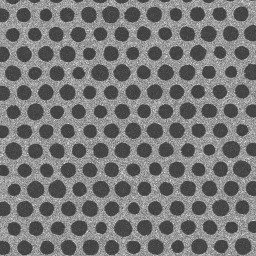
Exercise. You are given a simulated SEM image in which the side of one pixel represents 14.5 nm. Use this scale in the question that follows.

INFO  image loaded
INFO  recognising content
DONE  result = a regular array of holes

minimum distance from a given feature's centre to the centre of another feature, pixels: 21.6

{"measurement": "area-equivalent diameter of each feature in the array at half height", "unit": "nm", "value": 217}